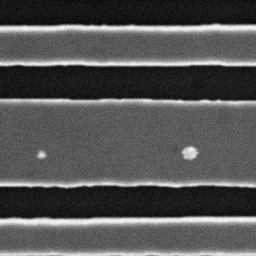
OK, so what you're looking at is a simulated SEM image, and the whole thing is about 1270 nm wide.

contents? lines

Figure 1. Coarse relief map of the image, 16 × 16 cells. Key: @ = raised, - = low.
----------------
----------------
@@@@@@@@@@@@@@@@
@@@@@@@@@@@@@@@@
----------------
----------------
@@@@@@@@@@@@@@@@
@@@@@@@@@@@@@@@@
@@@@@@@@@@@@@@@@
@@@@@@@@@@@@@@@@
@@@@@@@@@@@@@@@@
@@@@@@@@@@@@@@@@
----------------
----------------
@@@@@@@@@@@@@@@@
@@@@@@@@@@@@@@@@